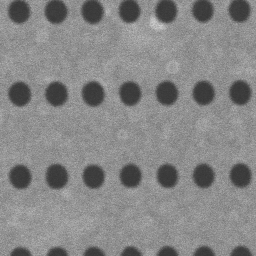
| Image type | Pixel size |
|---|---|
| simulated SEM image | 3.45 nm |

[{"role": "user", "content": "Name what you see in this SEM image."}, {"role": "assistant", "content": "a regular array of holes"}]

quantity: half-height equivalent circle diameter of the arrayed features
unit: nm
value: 82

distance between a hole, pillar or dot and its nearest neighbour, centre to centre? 126 nm